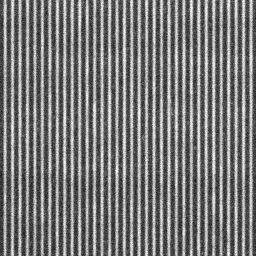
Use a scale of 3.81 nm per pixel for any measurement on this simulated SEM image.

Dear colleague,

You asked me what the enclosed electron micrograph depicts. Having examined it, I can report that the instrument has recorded parallel lines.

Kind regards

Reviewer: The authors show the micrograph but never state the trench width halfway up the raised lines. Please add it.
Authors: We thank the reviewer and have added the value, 4.88 pixels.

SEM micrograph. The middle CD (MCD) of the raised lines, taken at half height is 9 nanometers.